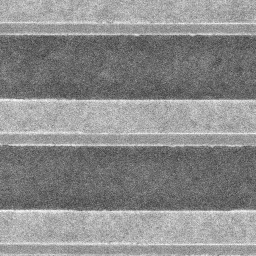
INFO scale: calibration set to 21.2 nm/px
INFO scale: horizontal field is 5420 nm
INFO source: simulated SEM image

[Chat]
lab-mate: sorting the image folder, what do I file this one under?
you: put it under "lines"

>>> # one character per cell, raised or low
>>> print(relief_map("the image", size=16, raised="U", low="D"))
UUUUUUUUUUUUUUUU
UUUUUUUUUUUUUUUU
DDDDDDDDDDDDDDDD
DDDDDDDDDDDDDDDD
DDDDDDDDDDDDDDDD
DDDDDDDDDDDDDDDD
UUUUUUUUUUUUUUUU
UUUUUUUUUUUUUUUU
UUUUUUUUUUUUUUUU
DDDDDDDDDDDDDDDD
DDDDDDDDDDDDDDDD
DDDDDDDDDDDDDDDD
DDDDDDDDDDDDDDDD
UUUUUUUUUUUUUUUU
UUUUUUUUUUUUUUUU
UUUUUUUUUUUUUUUU